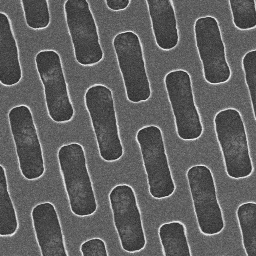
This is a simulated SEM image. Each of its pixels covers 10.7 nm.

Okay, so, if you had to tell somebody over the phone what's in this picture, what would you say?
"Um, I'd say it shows a regular array of holes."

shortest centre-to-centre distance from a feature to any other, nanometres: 665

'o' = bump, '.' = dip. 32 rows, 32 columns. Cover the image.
ooo...oo...oo...ooo..oooooooo...
ooo...oo...oooooooo...ooooooo...
.oo...oo....ooooooo...ooo..oo...
.ooo.oooo...ooooooo...oo...ooo.o
..ooooooo...ooo..oo...oo....oooo
..ooooooo...oo...ooo..ooo...oooo
..ooo..oo....o....ooooooo...ooo.
..oo....oo..ooo...ooooooo...oo..
...oo...ooooooo...ooooooo....oo.
...oo...ooooooo...ooo...oo...oo.
o.ooo...oooooooo...oo...ooooooo.
oooooo..ooo...oo...oo...ooooooo.
oooooo...oo...oo..ooo...ooooooo.
oo.ooo...oo...oooooooo..oooooooo
o...oo...oo...oooooooo...oo...oo
o...oooooooo...ooooooo...oo...oo
o....ooooooo...oo...oo...oo....o
oo...ooooooo...oo...ooooooo....o
oo...ooo..oo...ooo...ooooooo...o
oo...oo....oo..ooo...ooooooo...o
oo...ooo...ooooooo...ooooooo...o
.oo..ooo...ooooooo...ooo..oo...o
.ooooooo...oooooooo...oo...ooooo
.ooooooo....oo..ooo...oo...ooooo
.oooooooo...oo...oo..ooo...ooooo
..ooo.ooo...oo...ooooooo...oooo.
..oo...oo...oo...ooooooo....oo..
..oo...ooooooo....ooooooo...oo..
..oo....ooooooo...oo...oo...oo..
ooooo...ooooooo...oo...ooooooo..
ooooo...oo...oo...oo...ooooooo..
ooooo...oo...ooooooo....ooooooo.